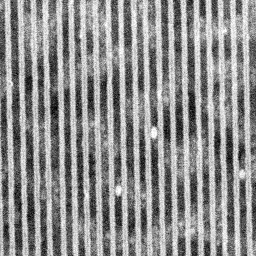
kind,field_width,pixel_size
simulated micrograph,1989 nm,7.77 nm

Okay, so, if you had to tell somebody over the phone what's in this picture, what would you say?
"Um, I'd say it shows parallel lines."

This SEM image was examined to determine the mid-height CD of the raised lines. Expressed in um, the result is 0.0301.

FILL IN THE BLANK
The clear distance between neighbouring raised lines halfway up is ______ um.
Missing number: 0.069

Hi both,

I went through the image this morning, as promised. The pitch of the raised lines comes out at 12.5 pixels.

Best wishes